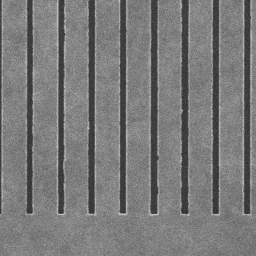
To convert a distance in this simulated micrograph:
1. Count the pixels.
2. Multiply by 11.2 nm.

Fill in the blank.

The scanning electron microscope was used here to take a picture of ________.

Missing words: parallel lines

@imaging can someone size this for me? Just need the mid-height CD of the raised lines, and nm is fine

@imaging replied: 266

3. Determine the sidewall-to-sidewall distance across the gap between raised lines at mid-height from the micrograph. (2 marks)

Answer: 85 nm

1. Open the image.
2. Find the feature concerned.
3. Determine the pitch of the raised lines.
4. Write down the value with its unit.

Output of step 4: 345 nanometers